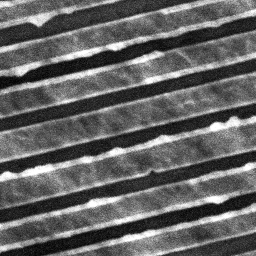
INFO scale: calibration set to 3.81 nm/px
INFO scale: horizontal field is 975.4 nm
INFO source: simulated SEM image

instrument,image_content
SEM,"parallel lines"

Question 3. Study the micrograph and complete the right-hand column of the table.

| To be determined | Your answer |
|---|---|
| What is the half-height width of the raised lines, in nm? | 106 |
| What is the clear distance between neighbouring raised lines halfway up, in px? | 14.5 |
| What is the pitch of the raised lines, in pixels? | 42.5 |